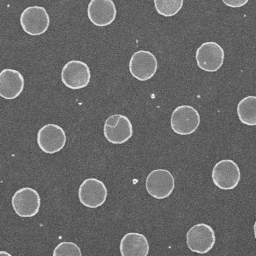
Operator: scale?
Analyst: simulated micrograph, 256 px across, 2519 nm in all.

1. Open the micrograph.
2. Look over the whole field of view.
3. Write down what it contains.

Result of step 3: a regular array of raised bodies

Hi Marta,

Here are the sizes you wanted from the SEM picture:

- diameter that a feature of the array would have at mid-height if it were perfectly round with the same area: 0.279 micrometres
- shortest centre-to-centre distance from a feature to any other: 662 nm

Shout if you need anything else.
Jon